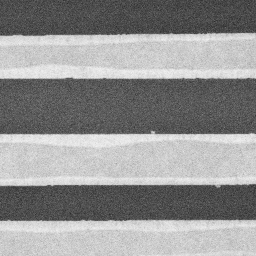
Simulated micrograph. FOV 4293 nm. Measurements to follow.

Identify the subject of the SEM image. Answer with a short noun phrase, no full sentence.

lines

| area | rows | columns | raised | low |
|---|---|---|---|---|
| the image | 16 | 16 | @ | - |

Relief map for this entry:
----------------
----------------
---@@@@@@@@@@@@@
@@@@@@@@@@@@@@@@
@@@-@@@@@@@@@@@@
----------------
----------------
----------------
----------------
@@@@@@@@@@@@@@@@
@@@@@@@@@@@@@@@@
----------------
----------------
----------------
@@@@@@@@@@@@@@@@
@@@@@@@@@@@@@@@@